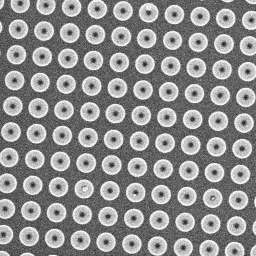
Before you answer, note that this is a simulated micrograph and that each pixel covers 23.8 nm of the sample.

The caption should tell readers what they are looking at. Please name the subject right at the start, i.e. an array of small figures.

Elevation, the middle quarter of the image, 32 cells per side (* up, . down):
**...****...****..****..*****..*
.............**...****...****..*
.........................***...*
**....**........................
***..****...***....**...........
***..****..*****..****..****...*
**...****..*****..****..****..**
......**...****...****..****..**
...................**...****...*
*...............................
**...***...***..................
**..*****..****..****...***.....
**..*****..****..*****..****..**
*....***...****..*****.*****..**
............**....***...****..**
.........................**....*
*....**.........................
**..****..****...***............
**..****..*****..****..****...**
*...****..*****..****..*****.***
.....**....***...****..****..***
........................***...**
*....*.........................*
*...****..****..................
*..*****..****..****...***....**
*..*****..****..*****..****..***
....***...****..*****..****..***
...........*.....***...****..***
........................*.....**
*...**.....*....................
*..****...***...****....*.......
*..****..*****..****..****...***